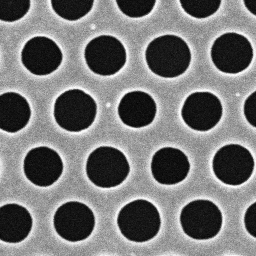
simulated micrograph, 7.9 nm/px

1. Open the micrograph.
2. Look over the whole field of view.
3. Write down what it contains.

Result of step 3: a regular array of holes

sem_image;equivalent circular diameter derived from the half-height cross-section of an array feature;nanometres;331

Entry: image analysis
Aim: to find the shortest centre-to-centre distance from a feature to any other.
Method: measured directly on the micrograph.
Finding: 0.491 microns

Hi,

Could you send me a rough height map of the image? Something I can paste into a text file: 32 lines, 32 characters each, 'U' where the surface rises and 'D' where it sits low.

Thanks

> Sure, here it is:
DDDDUUDDDDDDUUUDDDDUUUUDDDDDUUUD
DDDUUUUDDDDUUUUDDDDUUUUDDDDUUUUD
DDUUUUUUDDUUUUUUUUUUUUUUUUUUUUUU
UUUUUUUUUUUUUUUUUUUUUUUUUUUUUUUU
UUUUUUUUUUUUDDUUUUUUDDUUUUUDDDUU
UUUDDDDUUUUDDDDUUUUDDDDUUUUDDDDU
UUUDDDDDUUUDDDDDUUDDDDDDUUDDDDDD
UUUDDDDDUUUDDDDDUUDDDDDDUUDDDDDD
UUUDDDDUUUUDDDDUUUUDDDDUUUUDDDDU
UUUUUUUUUUUUUDUUUUUUDDUUUUUUUUUU
UUUUUUUUUUUUUUUUUUUUUUUUUUUUUUUU
UUUUUUUUDDDUUUUUDDUUUUUUUDUUUUUU
DDDUUUUDDDDDUUUDDDDUUUUDDDDUUUUD
DDDDUUUDDDDDUUUDDDDDUUUDDDDDUUDD
DDDDUUUDDDDDUUUDDDDUUUUDDDDDUUUD
DDDUUUUDDDDUUUUUDDDUUUUDDDDUUUUD
UDUUUUUUUUUUUUUUUUUUUUUUUUUUUUUU
UUUUUUUUUUUUUUUUUUUUUUUUUUUUUUUU
UUUUDDUUUUUUDDUUUUUUDDUUUUUUDDDU
UUUDDDDUUUUDDDDDUUUDDDDUUUUDDDDD
UUUDDDDDUUUDDDDDUUUDDDDDUUDDDDDD
UUUDDDDDUUUDDDDDUUUDDDDDUUUDDDDD
UUUUDDDUUUUDDDDDUUUDDDDUUUUDDDDU
UUUUUUUUUUUUUDUUUUUUUUUUUUUUUUUU
UUUUUUUUUUUUUUUUUUUUUUUUUUUUUUUU
UDUUUUUUDDUUUUUUDDDUUUUDDDDUUUUU
DDDDUUUDDDDDUUUDDDDDUUUDDDDDUUUD
DDDDUUUDDDDDUUUDDDDDUUDDDDDDUUUD
DDDDUUUDDDDDUUUDDDDDUUUDDDDDUUUD
DDDUUUUUDDDUUUUDDDDUUUUDDDDUUUUU
UUUUUUUUUUUUUUUUUUUUUUUUUUUUUUUU
UUUUUUUUUUUUUUUUUUUUUUUUUUUUUUUU